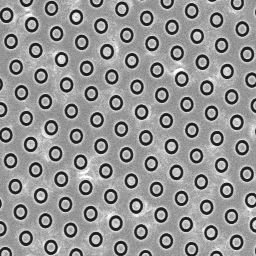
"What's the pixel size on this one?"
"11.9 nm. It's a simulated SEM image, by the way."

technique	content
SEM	a regular array of ring-shaped grooves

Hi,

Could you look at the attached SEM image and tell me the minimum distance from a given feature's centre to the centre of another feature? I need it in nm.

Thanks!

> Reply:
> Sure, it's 308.